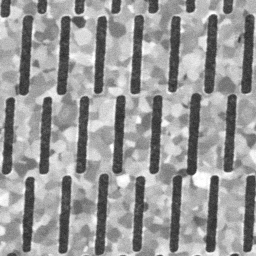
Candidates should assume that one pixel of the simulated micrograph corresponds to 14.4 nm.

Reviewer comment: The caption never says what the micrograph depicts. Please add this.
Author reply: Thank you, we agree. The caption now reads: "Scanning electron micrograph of a regular array of holes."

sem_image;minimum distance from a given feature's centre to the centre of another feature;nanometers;528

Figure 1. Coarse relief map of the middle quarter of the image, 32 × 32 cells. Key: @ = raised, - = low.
-@@@@@@---@@@@@@@--@@@@@@@---@@@
-@@@@@@---@@@@@@@--@@@@@@@---@@@
-@@@@@@---@@@@@@@--@@@@@@@---@@@
-@@@@@@---@@@@@@---@@@@@@@---@@@
-@@@@@@---@@@@@@---@@@@@@@---@@@
-@@@@@@---@@@@@@---@@@@@@@--@@@@
-@@@@@@---@@@@@@---@@@@@@@--@@@@
@@@@@@@@-@@@@@@@@--@@@@@@@@@@@@@
@@@@--@@@@@@@--@@@@@@@---@@@@@@-
@@@@--@@@@@@@---@@@@@@---@@@@@@-
@@@@--@@@@@@@--@@@@@@@---@@@@@@-
@@@@--@@@@@@@--@@@@@@@---@@@@@@-
@@@@--@@@@@@@---@@@@@@---@@@@@@-
@@@---@@@@@@@--@@@@@@@---@@@@@@-
@@@---@@@@@@@--@@@@@@@---@@@@@@-
@@@---@@@@@@---@@@@@@@---@@@@@@-
@@@---@@@@@@---@@@@@@@--@@@@@@@-
-@@---@@@@@@@--@@@@@@@--@@@@@@@-
@@@---@@@@@@---@@@@@@@--@@@@@@@-
@@@---@@@@@@---@@@@@@---@@@@@@@-
-@@---@@@@@@---@@@@@@---@@@@@@@-
-@@---@@@@@@---@@@@@@---@@@@@@@-
@@@---@@@@@@---@@@@@@---@@@@@@@-
@@@---@@@@@@---@@@@@@---@@@@@@@-
@@@---@@@@@@---@@@@@@---@@@@@@@-
@@@---@@@@@@---@@@@@@---@@@@@@@-
@@@---@@@@@@---@@@@@@---@@@@@@--
@@@@-@@@@--@@@@@@@@@@@-@@@@@@@@-
--@@@@@@@--@@@@@@@--@@@@@@@---@@
--@@@@@@---@@@@@@@--@@@@@@@---@@
--@@@@@@---@@@@@@@------@@@---@@
--@@@@@@---@@@@@@@--@--@@@@---@@